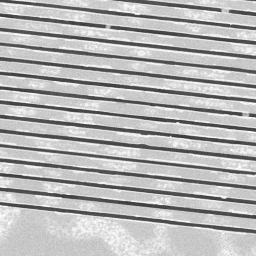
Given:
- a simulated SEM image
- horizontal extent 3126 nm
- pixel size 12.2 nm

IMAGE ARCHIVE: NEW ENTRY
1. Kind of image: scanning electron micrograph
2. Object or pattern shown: parallel lines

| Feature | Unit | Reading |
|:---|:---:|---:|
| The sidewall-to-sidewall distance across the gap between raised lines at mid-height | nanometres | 47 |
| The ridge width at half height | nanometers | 128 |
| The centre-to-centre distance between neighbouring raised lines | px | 14.4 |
